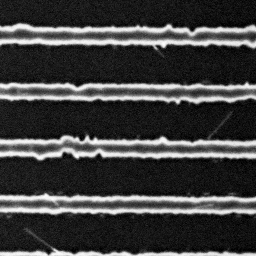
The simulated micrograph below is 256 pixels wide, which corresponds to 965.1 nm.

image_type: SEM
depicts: parallel lines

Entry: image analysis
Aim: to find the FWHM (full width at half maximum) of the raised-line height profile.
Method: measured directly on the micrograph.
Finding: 50.5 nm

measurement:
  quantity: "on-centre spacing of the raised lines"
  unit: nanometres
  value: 212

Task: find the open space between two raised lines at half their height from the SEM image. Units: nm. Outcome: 161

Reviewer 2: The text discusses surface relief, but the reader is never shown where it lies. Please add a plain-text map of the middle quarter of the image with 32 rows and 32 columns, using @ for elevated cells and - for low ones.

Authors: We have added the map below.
--------------------------------
--------------------------------
--------------------------------
--------------------------------
--------------------------------
@----@@@@@@@@-@@@@@@@@@----@@---
@@@@@@@@@@@@@@@@@@@@@@@@@@@@@@@@
@@@@@@@@@@@@@@@@@@@@@@@@@@@@@@@@
@-@@@@@@-@@@@@@-@@@-@@@@@@@@@@@@
----------------------------@---
--------------------------------
--------------------------------
--------------------------------
--------------------------------
--------------------------------
--------------------------------
--------------------------------
--------------------------------
@@------------------------------
@@@@-@@@@@@@@@@--@@-@@-@@@------
@@@@@@@@@@@@@@@@@@@@@@@@@@@@@@@@
@@@@@@@@@@@@@@@@@@@@@@@@@@@@@@@@
--@@@@@@--@@@@@@@@@@@@@@@@@@@@@@
--------------------------------
--------------------------------
--------------------------------
--------------------------------
--------------------------------
--------------------------------
--------------------------------
--------------------------------
--------------------------------